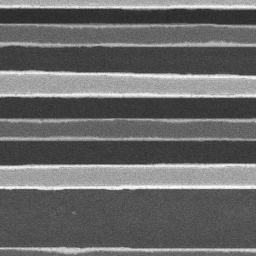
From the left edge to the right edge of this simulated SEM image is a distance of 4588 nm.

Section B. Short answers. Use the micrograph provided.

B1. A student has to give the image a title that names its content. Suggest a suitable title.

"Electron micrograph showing lines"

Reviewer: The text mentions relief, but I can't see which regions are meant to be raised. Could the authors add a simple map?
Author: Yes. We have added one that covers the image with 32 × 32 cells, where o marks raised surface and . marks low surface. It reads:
oooooooooooooooooooooooooooooooo
................................
................................
oooooooooooooooooooooooooooooooo
oooooooooooooooooooooooooooooooo
oooooooooooooooooooooooooooooooo
................................
................................
................................
ooooooooooooooooooooooooo.......
oooooooooooooooooooooooooooooooo
oooooooooooooooooooooooooooooooo
................................
................................
................................
oooooooooooooooooooooooooooooooo
oooooooooooooooooooooooooooooooo
....................oo.........o
................................
................................
................................
oooooooooooooooooooooooooooooooo
oooooooooooooooooooooooooooooooo
ooooooooooooooooooooo..oo.......
................................
................................
................................
................................
................................
................................
................................
oooooooooooooooooooooooooooooooo